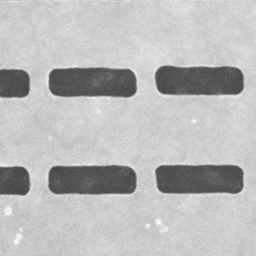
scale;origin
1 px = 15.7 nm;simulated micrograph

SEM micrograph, holes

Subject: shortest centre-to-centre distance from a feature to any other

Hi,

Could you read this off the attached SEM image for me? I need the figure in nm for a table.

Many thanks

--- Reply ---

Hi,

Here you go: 1540